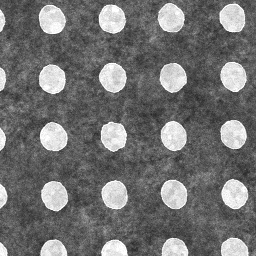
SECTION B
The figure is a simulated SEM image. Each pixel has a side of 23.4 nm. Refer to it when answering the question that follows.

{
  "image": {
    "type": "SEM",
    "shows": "a regular array of raised bodies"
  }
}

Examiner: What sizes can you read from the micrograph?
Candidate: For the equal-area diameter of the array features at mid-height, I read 637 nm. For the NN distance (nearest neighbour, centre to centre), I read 58.4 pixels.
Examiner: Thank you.